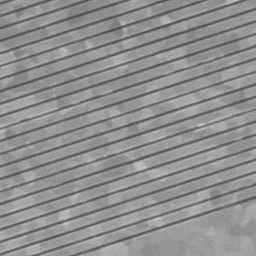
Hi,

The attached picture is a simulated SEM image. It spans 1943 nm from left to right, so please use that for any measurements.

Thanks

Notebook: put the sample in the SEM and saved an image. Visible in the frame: parallel lines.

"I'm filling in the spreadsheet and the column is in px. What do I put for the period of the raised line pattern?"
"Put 11.9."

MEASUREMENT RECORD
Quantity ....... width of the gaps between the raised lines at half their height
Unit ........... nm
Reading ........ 24.4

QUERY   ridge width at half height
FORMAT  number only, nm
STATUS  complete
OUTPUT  66